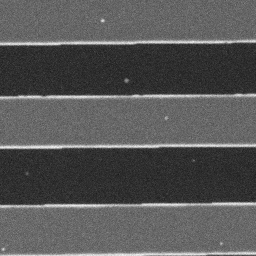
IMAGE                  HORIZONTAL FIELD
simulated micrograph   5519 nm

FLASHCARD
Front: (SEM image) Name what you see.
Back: lines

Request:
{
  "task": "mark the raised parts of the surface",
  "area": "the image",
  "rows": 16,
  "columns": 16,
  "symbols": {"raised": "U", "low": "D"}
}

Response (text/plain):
UUUUUUUUUUUUUUUU
UUUUUUUUUUUUUUUU
UUUUUUUUUUUUUUUU
DDDDDDDDDDDDDDDD
DDDDDDDDDDDDDDDD
DDDDDDDDDDDDDDDD
UUUUUUUUUUUUUUUU
UUUUUUUUUUUUUUUU
UUUUUUUUUUUUUUUU
DDDDDDDDDDDDDDDD
DDDDDDDDDDDDDDDD
DDDDDDDDDDDDDDDD
DDDDDDDDDDDDDDDD
UUUUUUUUUUUUUUUU
UUUUUUUUUUUUUUUU
UUUUUUUUUUUUUUUU